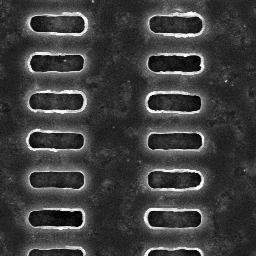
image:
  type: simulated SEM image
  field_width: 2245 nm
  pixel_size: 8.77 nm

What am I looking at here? a regular array of holes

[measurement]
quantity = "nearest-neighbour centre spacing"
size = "0.34 um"